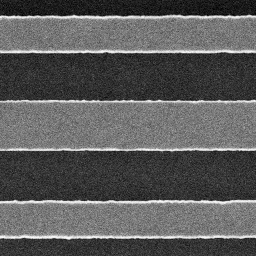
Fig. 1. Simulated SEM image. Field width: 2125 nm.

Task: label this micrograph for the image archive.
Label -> lines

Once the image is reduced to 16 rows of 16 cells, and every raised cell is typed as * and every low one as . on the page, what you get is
................
****************
****************
................
................
................
****************
****************
****************
................
................
................
................
****************
****************
................